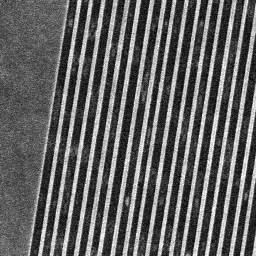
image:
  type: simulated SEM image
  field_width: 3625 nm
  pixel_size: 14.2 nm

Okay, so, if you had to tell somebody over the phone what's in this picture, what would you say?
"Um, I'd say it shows parallel lines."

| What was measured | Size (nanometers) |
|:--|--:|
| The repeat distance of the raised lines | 167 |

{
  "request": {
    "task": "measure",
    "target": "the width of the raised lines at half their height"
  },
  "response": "49 nanometers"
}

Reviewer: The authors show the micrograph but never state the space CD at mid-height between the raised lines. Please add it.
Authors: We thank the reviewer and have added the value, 112 nm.